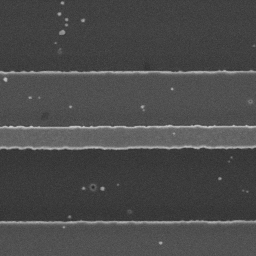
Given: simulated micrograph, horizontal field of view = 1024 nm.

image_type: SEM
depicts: lines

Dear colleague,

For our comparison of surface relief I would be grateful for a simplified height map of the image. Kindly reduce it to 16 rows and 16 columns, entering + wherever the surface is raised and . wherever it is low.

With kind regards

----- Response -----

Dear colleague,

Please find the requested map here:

................
................
................
................
..+...+.+++.++++
++++++++++++++++
++++++++++++++++
++++++++++++++++
++++++++++++++++
................
................
................
................
................
++++++++++++++++
++++++++++++++++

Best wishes